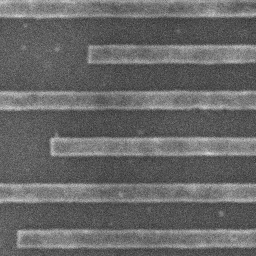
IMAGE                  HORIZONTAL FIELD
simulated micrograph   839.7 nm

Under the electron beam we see parallel lines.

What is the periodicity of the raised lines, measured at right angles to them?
151 nm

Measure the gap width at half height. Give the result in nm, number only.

93.5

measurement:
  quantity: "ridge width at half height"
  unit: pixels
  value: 17.6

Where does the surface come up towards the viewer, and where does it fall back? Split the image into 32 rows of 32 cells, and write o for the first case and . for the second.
oooooooooooooooooooooooooooooooo
oooooooooooooooooooooooooooooooo
................................
................................
................................
................................
...........ooooooooooooooooooooo
...........ooooooooooooooooooooo
................................
................................
................................
....................oooo.o.....o
oooooooooooooooooooooooooooooooo
oooooooooooooooooooooooooooooooo
................................
................................
................................
.......ooooooooooooooooooooooooo
......oooooooooooooooooooooooooo
................................
................................
................................
................................
oooooooooooooooooooooooooooooooo
oooooooooooooooooooooooooooooooo
................................
................................
................................
................................
..oooooooooooooooooooooooooooooo
..oooooooooooooooooooooooooooooo
................................